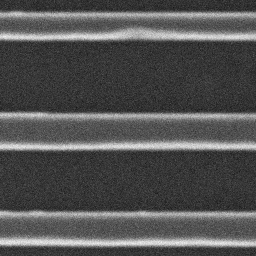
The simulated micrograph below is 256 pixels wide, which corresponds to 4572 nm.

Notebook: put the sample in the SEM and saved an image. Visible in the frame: lines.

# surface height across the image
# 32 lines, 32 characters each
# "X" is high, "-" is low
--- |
--------------------------------
--------------------------------
XXXXXXXXXXXXXXXXXXXXXXXXXXXXXXXX
XXXXXXXXXXXXXXXXXXXXXXXXXXXXXXXX
XXXXXXXXXXXXXXXX--XXXXXXXXXXXXXX
--------------------------------
--------------------------------
--------------------------------
--------------------------------
--------------------------------
--------------------------------
--------------------------------
--------------------------------
--------------------------------
XXXXXXXXXXXXXXXXXXXXXXXXXXXXXXXX
XXXXXXXXXXXXXXXXXXXXXXXXXXXXXXXX
XXXXXXXXXXXXXXXXXXXXXXXXXXXXXXXX
XXXXXXXXXXXXXXXXXXXXXXXXXXXXXXXX
-----XXXXX-X--------------------
--------------------------------
--------------------------------
--------------------------------
--------------------------------
--------------------------------
--------------------------------
--------------------------------
--------------------------------
XXXXXXXXXXXXXXXXXXXXXXXXXXXXXXXX
XXXXXXXXXXXXXXXXXXXXXXXXXXXXXXXX
XXXXXXXXXXXXXXXXXXXXXXXXXXXXXXXX
------------------------------XX
--------------------------------